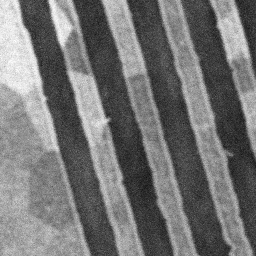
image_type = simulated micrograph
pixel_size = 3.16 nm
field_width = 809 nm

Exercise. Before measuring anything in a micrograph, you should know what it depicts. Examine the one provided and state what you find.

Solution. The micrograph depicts parallel lines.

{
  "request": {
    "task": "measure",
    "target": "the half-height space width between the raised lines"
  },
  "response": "109 nm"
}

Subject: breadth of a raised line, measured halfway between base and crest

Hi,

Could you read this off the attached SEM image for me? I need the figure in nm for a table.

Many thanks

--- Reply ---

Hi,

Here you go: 54.8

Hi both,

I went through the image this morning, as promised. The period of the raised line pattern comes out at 0.165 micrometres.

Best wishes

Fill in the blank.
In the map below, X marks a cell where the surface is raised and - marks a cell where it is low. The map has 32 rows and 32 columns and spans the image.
XX-----XX----XXX----XX-----XX---
XX-----XX-----XX----XXX----XX---
XX-----XX-----XX-----XX----XXX--
XXX----XXX----XX-----XX-----XX--
XXX-----XX----XXX----XX-----XX--
XXXX----XX-----XX-----XX----XX--
XXXX----XX-----XX-----XX-----XX-
XXXX-----XX----XXX----XX-----XX-
XXXX-----XX-----XX----XXX----XX-
XXXXX----XX-----XX-----XX----XX-
XXXXX----XXX----XXX----XX-----XX
XXXXX-----XX----XXX----XXX----XX
XXXXX-----XX-----XX-----XX----XX
XXXXXX----XX-----XX-----XX-----X
XXXXXX----XXX----XXX----XX-----X
XXXXXX-----XX-----XX----XXX----X
XXXXXXX----XXX----XX-----XX----X
XXXXXXX----XXX----XX-----XX-----
XXXXXXX-----XX----XXX----XX-----
XXXXXXX-----XX-----XX----XXX----
XXXXXXXX----XX-----XX-----XX----
XXXXXXXX----XXX----XX-----XX----
XXXXXXXX-----XX----XXX----XXX---
XXXXXXXX-----XX-----XX-----XX---
XXXXXXXXX----XXX----XX-----XX---
XXXXXXXXX-----XX----XX-----XX---
XXXXXXXXX-----XX-----XX----XXX--
XXXXXXXXXX----XX-----XX-----XX--
XXXXXXXXXX----XXX----XX-----XX--
XXXXXXXXXX-----XX-----XX----XX--
XXXXXXXXXXX----XX-----XX-----XX-
XXXXXXXXXXX----XXX----XX-----XX-